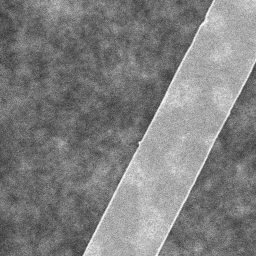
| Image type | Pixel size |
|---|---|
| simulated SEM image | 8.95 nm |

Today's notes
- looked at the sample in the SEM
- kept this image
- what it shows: one or a few lines or trenches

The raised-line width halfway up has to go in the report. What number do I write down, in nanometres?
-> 581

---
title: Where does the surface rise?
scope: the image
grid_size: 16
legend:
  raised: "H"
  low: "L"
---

LLLLLLLLLLLLLHHH
LLLLLLLLLLLLLHHH
LLLLLLLLLLLLHHHH
LLLLLLLLLLLLHHHH
LLLLLLLLLLLHHHHH
LLLLLLLLLLLHHHHL
LLLLLLLLLLHHHHHL
LLLLLLLLLLHHHHLL
LLLLLLLLLHHHHHLL
LLLLLLLLLHHHHLLL
LLLLLLLLHHHHHLLL
LLLLLLLHHHHHLLLL
LLLLLLLHHHHHLLLL
LLLLLLHHHHHLLLLL
LLLLLLHHHHHLLLLL
LLLLLHHHHHLLLLLL